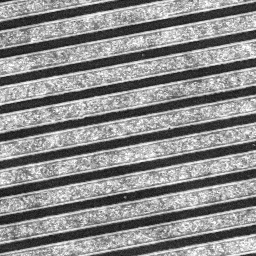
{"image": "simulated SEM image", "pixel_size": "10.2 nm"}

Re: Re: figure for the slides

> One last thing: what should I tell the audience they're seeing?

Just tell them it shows parallel lines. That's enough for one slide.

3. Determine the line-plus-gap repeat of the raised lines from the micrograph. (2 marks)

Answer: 0.278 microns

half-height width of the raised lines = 171 nanometres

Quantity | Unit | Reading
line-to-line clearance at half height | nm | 107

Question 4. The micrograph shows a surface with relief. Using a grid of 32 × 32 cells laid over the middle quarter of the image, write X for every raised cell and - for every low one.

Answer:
-------------XXXXXXXXXXXXXXXXXXX
-------XXXXXXXXXXXXXXXXXXXXXXXX-
--XXXXXXXXXXXXXXXXXXXXXXX-------
XXXXXXXXXXXXXXXXXXXX------------
XXXXXXXXXXXXXXX--------------XXX
XXXXXXXXX--------------XXXXXXXXX
XXXX--------------XXXXXXXXXXXXXX
------------XXXXXXXXXXXXXXXXXXXX
-------XXXXXXXXXXXXXXXXXXXXXXXX-
--XXXXXXXXXXXXXXXXXXXXXXX-------
XXXXXXXXXXXXXXXXXXXX------------
XXXXXXXXXXXXXXX-------------XXXX
XXXXXXXXX--------------XXXXXXXXX
XXXXX-------------XXXXXXXXXXXXXX
------------XXXXXXXXXXXXXXXXXXXX
-------XXXXXXXXXXXXXXXXXXXXXX---
-XXXXXXXXXXXXXXXXXXXXXXX--------
XXXXXXXXXXXXXXXXXX--------------
XXXXXXXXXXXXX---------------XXXX
XXXXXXXX---------------XXXXXXXXX
XX---------------XXXXXXXXXXXXXXX
------------XXXXXXXXXXXXXXXXXXXX
-------XXXXXXXXXXXXXXXXXXXXXX---
-XXXXXXXXXXXXXXXXXXXXXXX--------
XXXXXXXXXXXXXXXXXXX-------------
XXXXXXXXXXXXX---------------XXXX
XXXXXXX----------------XXXXXXXXX
XX---------------XXXXXXXXXXXXXXX
------------XXXXXXXXXXXXXXXXXXXX
------XXXXXXXXXXXXXXXXXXXXXXX---
-XXXXXXXXXXXXXXXXXXXXXX---------
XXXXXXXXXXXXXXXXXX--------------